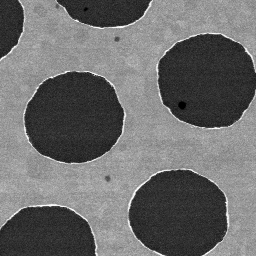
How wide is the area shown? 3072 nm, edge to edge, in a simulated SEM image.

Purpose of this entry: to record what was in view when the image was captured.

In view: holes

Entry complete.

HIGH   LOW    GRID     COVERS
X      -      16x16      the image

-XXX-----XXXXXXX
-XXXX---XXXXXXXX
-XXXXXXXXXX----X
XXXXXXXXXX------
XXXX-XXXXX------
XX-----XXX------
XX------XX------
XX------XXX----X
XX------XXXXXXXX
XX-----XXXXXXXXX
XXXXXXXXXXXXXXXX
XXXXXXXXX----XXX
XXXXXXXX------XX
X----XXX------XX
------XX------XX
------XXX----XXX